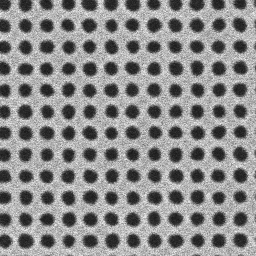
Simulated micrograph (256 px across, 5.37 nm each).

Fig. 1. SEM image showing a regular array of holes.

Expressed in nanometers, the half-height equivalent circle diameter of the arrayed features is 77.8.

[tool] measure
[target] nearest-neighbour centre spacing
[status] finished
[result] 113 nm